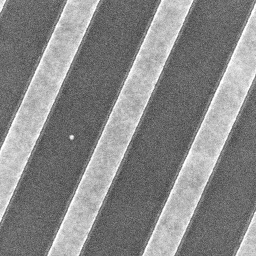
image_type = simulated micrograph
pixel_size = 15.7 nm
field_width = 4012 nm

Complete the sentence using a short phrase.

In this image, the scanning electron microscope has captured lines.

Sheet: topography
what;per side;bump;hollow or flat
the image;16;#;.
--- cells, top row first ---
....##....##....
....##...##....#
...##....##....#
...##....#.....#
..##....##....##
..##....##....##
.##....##....##.
.##....##....##.
##....##....##..
##....##....##..
#....##....##...
#....##....##...
#....#....##....
....##....##....
....##....##...#
...##....##....#